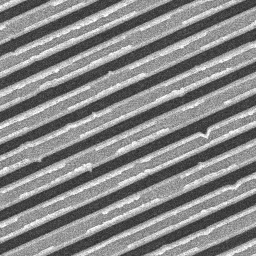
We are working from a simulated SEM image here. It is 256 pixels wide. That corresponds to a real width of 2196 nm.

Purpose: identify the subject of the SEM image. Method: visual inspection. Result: parallel lines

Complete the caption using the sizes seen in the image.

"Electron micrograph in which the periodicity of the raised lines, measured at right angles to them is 0.258 microns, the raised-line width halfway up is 144 nm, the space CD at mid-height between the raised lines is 0.113 microns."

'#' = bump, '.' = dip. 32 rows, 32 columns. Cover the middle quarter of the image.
#######..........#########......
#####.........##########........
###........###########........##
#.........#########.........####
........#########.........######
......#########.........########
...##########........##########.
.##########........###########..
########.........#########......
######.........#########........
####.........#########.........#
##........##########........####
........##########........######
......#########.........########
....#########.........#########.
.##########.........#########...
#########........##########.....
#######........##########.......
####.........#########..........
##.........#########.........###
.........#########.........#####
.......#########........########
....##########........##########
..#########.........#########...
#########.........#########.....
#######.........#########.......
#####.........#########.........
###........##########.........##
#........##########.........####
.......##########........#######
.....##########........#########
...#########.........#########..